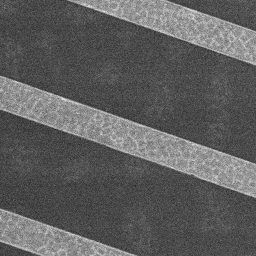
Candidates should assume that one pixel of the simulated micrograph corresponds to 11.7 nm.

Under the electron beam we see one or a few lines or trenches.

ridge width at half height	351	nanometers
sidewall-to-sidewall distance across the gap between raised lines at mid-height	1110	nanometers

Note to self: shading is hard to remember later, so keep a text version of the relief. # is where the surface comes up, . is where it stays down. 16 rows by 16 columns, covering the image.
......######....
.........#####..
............####
..............##
................
##..............
#####...........
..######........
.....######.....
........######..
...........#####
..............##
................
#...............
####............
.######.........